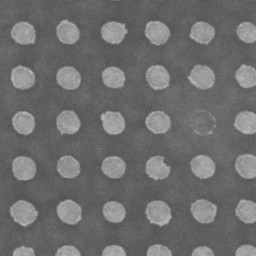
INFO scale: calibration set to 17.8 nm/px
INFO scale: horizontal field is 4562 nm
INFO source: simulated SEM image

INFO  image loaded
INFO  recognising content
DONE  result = a regular array of raised bodies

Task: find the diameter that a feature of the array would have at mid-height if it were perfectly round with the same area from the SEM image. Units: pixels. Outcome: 23.4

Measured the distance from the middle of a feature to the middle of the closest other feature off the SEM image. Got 0.79 microns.